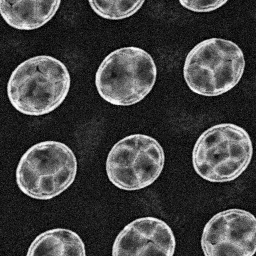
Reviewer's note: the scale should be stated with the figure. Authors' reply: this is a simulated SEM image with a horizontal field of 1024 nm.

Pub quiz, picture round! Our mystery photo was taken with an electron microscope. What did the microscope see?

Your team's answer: raised bodies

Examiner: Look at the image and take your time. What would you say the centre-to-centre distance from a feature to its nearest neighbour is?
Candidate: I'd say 344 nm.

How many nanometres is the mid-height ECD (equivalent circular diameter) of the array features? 223